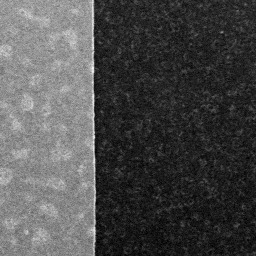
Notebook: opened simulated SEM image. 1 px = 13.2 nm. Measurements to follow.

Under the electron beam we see one or a few lines or trenches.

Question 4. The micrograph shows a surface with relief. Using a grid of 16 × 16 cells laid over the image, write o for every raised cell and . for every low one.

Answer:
oooooo..........
oooooo..........
oooooo..........
oooooo..........
oooooo..........
oooooo..........
oooooo..........
oooooo..........
oooooo..........
oooooo..........
oooooo..........
oooooo..........
oooooo..........
oooooo..........
oooooo..........
oooooo..........